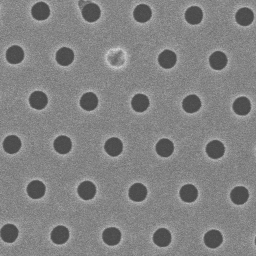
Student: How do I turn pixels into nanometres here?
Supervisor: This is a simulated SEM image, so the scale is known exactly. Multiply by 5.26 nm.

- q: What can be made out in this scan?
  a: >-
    a regular array of holes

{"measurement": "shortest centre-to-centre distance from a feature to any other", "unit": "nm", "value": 267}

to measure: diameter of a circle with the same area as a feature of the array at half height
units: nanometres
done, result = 101